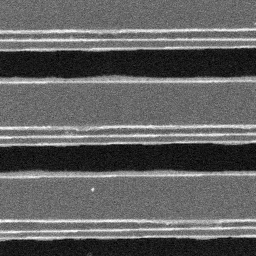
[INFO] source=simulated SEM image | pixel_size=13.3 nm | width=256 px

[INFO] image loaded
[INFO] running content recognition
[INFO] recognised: lines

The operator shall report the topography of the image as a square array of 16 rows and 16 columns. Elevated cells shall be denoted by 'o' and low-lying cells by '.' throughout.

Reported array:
oooooooooooooooo
oooooooooooooooo
oooooooooooooooo
................
................
oooooooooooooooo
oooooooooooooooo
oooooooooooooooo
oooooooooooooooo
................
................
oooooooooooooooo
oooooooooooooooo
oooooooooooooooo
oooooooooooooooo
................